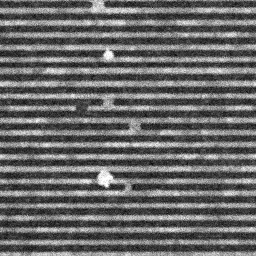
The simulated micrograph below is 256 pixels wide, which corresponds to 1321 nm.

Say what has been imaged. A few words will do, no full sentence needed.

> parallel lines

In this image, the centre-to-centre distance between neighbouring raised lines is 62.8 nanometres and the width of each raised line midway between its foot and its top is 0.0239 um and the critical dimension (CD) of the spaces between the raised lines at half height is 7.38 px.